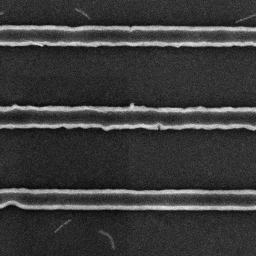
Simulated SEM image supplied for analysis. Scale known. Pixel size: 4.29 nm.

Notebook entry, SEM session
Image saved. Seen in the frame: one or a few lines or trenches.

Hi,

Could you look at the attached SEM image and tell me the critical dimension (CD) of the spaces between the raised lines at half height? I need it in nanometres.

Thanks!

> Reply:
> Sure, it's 278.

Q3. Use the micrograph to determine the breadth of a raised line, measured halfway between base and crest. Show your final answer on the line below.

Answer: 72.4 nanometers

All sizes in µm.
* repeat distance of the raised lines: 0.35